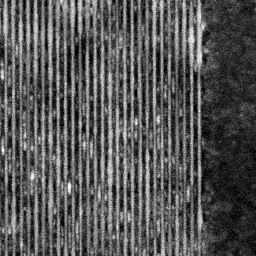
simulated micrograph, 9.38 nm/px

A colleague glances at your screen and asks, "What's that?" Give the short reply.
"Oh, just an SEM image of parallel lines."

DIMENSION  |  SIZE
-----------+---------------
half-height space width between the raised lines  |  0.0492 micrometres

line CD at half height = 0.0223 um